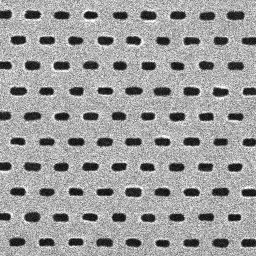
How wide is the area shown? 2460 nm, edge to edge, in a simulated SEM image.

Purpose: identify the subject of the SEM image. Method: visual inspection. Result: a regular array of holes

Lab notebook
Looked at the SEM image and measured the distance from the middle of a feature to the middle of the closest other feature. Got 0.274 um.